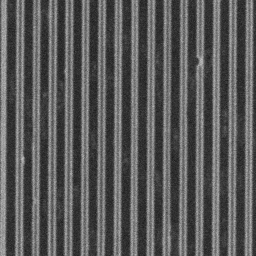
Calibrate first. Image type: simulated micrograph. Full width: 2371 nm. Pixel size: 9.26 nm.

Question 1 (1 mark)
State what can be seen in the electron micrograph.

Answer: parallel lines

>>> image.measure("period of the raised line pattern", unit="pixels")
16.4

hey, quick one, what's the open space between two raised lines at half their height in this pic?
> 0.0995 microns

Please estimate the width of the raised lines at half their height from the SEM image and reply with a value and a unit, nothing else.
5.75 px